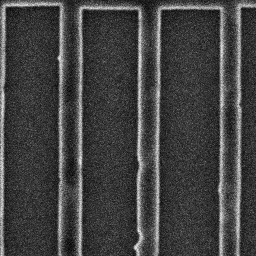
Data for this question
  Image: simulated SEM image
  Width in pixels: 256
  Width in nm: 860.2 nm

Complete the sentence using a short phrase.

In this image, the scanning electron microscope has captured one or a few lines or trenches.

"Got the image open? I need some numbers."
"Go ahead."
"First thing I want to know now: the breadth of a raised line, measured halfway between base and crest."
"65 nm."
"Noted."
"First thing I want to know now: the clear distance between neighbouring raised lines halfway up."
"195 nm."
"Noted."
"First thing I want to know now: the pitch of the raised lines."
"0.268 µm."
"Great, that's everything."